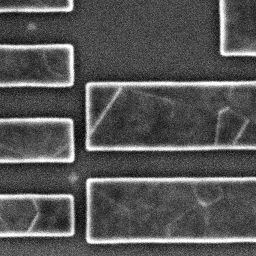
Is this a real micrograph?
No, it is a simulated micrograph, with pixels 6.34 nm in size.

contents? wiring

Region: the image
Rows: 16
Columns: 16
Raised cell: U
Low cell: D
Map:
UUUUDDDDDDDDDDUU
DDDDDDDDDDDDDDUU
DDDDDDDDDDDDDDUU
UUUUUDDDDDDDDDDD
UUUUUDDDDDDDDDDD
DDDDDDUUUUUUUUUU
DDDDDUUUUUUUUUUU
UUUUDUUUUUUUUUUU
UUUUUUUUUUUUUUUU
UUUUUDDDDDDDDDDD
DDDDDDDDDDDDDDDD
DDDDDDUUUUUUUUUU
UUUUDUUUUUUUUUUU
UUUUUUUUUUUUUUUU
UUUUDUUUUUUUUUUU
DDDDDDDDDDDDDDDD